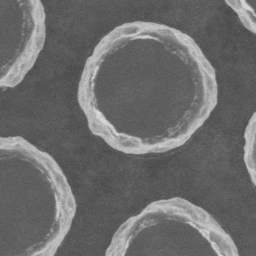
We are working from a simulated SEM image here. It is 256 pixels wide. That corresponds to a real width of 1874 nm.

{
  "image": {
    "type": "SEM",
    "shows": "raised bodies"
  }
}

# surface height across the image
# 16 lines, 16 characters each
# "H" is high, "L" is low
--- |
HHLLLLLLLLLLLLLH
HHLLLLLLLLLLLLLL
HHLLLLLHHHHHLLLL
HHLLLLHHHHHHLLLL
HLLLLHHHHHHHHLLL
LLLLLHHHHHHHHLLL
LLLLLHHHHHHHHLLL
LLLLLLHHHHHHHLLL
LLLLLLLHHHHHLLLL
HHLLLLLLLLLLLLLH
HHHLLLLLLLLLLLLL
HHHHLLLLLLLLLLLL
HHHHLLLLLLLLLLLL
HHHHLLLLLHHHLLLL
HHHHLLLLHHHHHHLL
HHHLLLLHHHHHHHLL